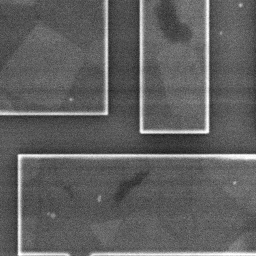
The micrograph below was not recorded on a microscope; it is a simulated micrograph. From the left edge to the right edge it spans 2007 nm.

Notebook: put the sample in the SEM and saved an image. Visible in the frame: wiring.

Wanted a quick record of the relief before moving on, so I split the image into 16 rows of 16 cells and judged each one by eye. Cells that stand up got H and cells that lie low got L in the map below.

HHHHHHHLLHHHHLLL
HHHHHHHLLHHHHLLL
HHHHHHHLLHHHHLLL
HHHHHHHLLHHHHLLL
HHHHHHHLLHHHHLLL
HHHHHHHLLHHHHLLL
HHHHHHHLLHHHHLLL
LLLLLLLLLHHHHLLL
LLLLLLLLLLLLLLLL
LLLLLLLLLLLLLLLL
LHHHHHHHHHHHHHHH
LHHHHHHHHHHHHHHH
LHHHHHHHHHHHHHHH
LHHHHHHHHHHHHHHH
LHHHHHHHHHHHHHHH
LHHHHHHHHHHHHHHH